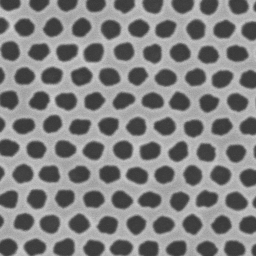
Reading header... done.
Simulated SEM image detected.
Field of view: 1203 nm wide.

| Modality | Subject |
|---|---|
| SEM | a regular array of holes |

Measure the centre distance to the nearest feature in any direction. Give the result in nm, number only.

127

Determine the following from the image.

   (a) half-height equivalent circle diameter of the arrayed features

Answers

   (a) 90.6 nm